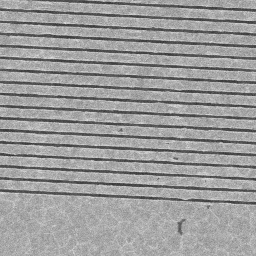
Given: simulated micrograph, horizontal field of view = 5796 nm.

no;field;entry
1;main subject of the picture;parallel lines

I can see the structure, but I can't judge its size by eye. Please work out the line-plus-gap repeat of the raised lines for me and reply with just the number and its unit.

272 nm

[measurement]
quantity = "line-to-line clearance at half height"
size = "3.37 pixels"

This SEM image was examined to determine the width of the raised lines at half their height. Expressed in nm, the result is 195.